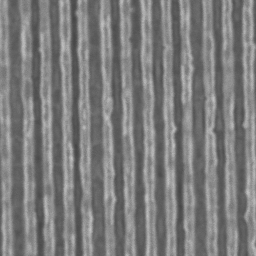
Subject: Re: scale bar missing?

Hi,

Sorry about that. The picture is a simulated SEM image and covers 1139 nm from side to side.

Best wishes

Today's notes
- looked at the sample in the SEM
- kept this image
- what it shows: parallel lines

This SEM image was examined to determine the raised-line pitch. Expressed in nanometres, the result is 90.4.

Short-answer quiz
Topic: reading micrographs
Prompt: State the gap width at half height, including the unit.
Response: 49.5 nm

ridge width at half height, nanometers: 41.7